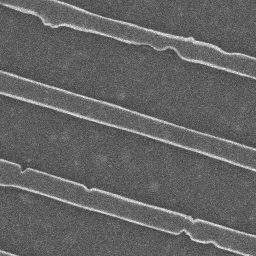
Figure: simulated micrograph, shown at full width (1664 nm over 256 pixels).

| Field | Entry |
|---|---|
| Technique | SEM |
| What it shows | one or a few lines or trenches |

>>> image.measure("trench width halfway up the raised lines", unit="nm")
424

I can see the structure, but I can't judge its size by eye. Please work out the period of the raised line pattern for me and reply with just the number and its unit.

553 nm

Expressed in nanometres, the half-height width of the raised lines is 124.